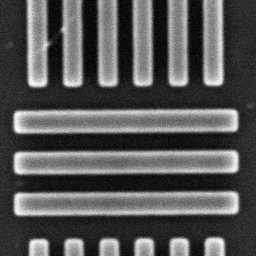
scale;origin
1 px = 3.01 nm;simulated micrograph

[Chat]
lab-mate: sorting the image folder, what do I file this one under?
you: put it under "groups of lines, slits or small figures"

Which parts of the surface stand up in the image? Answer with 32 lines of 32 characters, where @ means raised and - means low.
----@@--@@--@@---@@--@@---@@----
----@@--@@--@@---@@--@@---@@----
----@@--@@--@@---@@--@@---@@----
----@@--@@--@@---@@--@@---@@----
----@@--@@--@@---@@--@@---@@----
----@@--@@--@@---@@--@@---@@----
----@@--@@--@@---@@--@@---@@----
----@@--@@--@@---@@--@@---@@----
----@@--@@--@@---@@--@@---@@----
----@@--@@--@@---@@--@@---@@----
----@---@@---@---@----@---@-----
--------------------------------
--------------------------------
--------------------------------
--@@@@@@@@@@@@@@@@@@@@@@@@@@@@--
--@@@@@@@@@@@@@@@@@@@@@@@@@@@@--
---@@@@-------------------------
--------------------------------
--------------------------------
--@@@@@@@@@@@@@@@@@@@@@@@@@@@@--
--@@@@@@@@@@@@@@@@@@@@@@@@@@@@--
--@@@@@@@@@@@@@@@---------------
--------------------------------
--------------------------------
--@@@@@@@@@@@@@@@@@@@@@@@@@@@@--
--@@@@@@@@@@@@@@@@@@@@@@@@@@@@--
--@@@@@@@@@@@@@@@@@@@@@@@@@@@---
--------------------------------
--------------------------------
--------------------------------
----@@--@@---@@--@@--@@---@@----
----@@--@@---@@--@@--@@---@@----